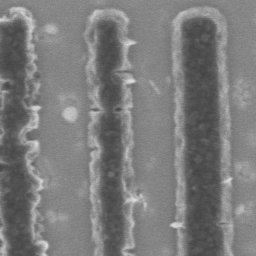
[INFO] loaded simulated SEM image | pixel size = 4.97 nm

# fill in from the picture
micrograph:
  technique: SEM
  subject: one or a few lines or trenches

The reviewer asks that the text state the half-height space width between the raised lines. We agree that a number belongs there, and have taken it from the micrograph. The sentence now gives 0.266 µm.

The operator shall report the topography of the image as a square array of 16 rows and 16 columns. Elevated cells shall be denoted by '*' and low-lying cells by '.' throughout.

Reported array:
................
**....**...***..
**....**...***..
**....**...***..
**....**...***..
**....**...***..
**....**...***..
**....**...***..
**....**...***..
**....**...***..
**....**...***..
**....**...***..
**....**...***..
**....**...***..
**....**...***..
***...**...***..